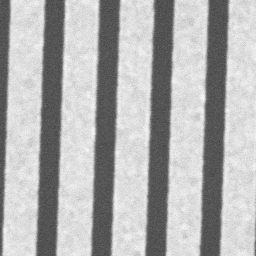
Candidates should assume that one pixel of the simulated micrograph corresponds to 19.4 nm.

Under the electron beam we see lines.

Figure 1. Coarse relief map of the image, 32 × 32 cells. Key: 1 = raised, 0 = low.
01111000111100011110001111000111
01111000111100011110001111000111
01111000111100011110001111000111
01111000111100011110001111000111
01111000111100011110001111000111
01111000111100011110001111000111
01111000111100011110001111000111
01111000111100011110001111001111
01111000111100011110001111001111
01111000111100011110001111001111
01111000111100011110011111001111
01111000111100011110011111001111
01111000111100011110011110001111
01111000111100011110011110001111
01111000111100011110011110001111
01111000111100011110011110001111
01111000111100011110011110001111
01111000111100011110011110001111
01111000111100011110011110001111
01111000111100111110011110001111
01111001111100111100011110001111
01111001111100111100011110001111
01111001111100111100011110001111
01111001111000111100011110001111
01111001111000111100011110001111
01111001111000111100011110001111
01111001111000111100011110001111
01111001111000111100011110001111
01111001111000111100011110001111
11111001111000111100011110001111
11110001111000111100011110001111
11110001111000111100011110001111